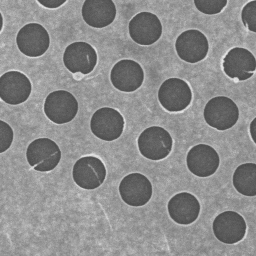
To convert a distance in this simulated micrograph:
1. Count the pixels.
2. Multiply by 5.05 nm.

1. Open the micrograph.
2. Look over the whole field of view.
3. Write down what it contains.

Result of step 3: a regular array of holes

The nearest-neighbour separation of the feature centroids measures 252 nanometers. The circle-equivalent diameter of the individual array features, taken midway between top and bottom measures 171 nanometres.